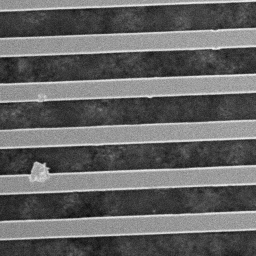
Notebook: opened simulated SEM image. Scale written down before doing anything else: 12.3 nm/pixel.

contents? parallel lines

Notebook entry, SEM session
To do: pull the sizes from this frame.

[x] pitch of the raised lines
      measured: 560 nanometres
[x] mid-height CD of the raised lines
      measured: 224 nm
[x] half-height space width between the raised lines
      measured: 0.335 micrometres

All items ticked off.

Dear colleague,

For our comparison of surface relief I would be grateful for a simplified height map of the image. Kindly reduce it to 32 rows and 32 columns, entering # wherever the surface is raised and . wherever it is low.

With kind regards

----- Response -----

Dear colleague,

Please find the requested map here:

####################............
................................
................................
................................
........########################
################################
###############.................
................................
................................
............................####
...#############################
################################
########........................
................................
................................
.....................###########
################################
#########################.......
................................
................................
....#...........................
....##.......###################
################################
##################..............
................................
................................
...............................#
.....###########################
################################
##########.#....................
................................
................................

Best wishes